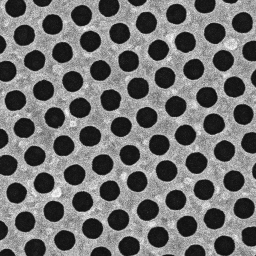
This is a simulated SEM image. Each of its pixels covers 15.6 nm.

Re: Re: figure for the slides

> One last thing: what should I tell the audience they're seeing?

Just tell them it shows a regular array of holes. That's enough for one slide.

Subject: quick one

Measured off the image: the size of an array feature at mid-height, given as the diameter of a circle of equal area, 0.333 micrometres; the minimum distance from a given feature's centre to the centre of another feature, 441 nanometres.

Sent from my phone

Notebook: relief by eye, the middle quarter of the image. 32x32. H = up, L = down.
HHHHHHHLLLLLHHLLLLLHHHHHHHHHHHLL
HHHHHHLLLLLLHHHLLLHHHHHLLLLHHHLL
LLLLHHHLLLLLHHHHHHHHHHHLLLLLHHLL
LLLLLHHLLLLHHHHHHHLLHHHLLLLLHHHL
LLLLLHHHHHHHHHHHLLLLLHHLLLLLHHHH
LLLLLHHHHHHHHHHHLLLLLHHLLLLHHHHH
HLLLHHHHHHLLLHHHLLLLLHHHHHHHHHHH
HHHHHHHHHLLLLLHHLLLLLHHHHHHHHHHH
HHHLLHHHHLLLLLHHHLLLHHHHHHLLLLHH
HHLLLLHHHLLLLLHHHHHHHHHHHHLLLLHH
HLLLLLLHHLLLLLHHHHHHHHHHHLLLLLLH
HLLLLLLHHHLLLHHHHHHLLLLHHLLLLLHH
HHLLLLHHHHHHHHHHHHLLLLLHHHLLLLHH
HHHLHHHHHHHHHLLLHHLLLLLHHHHHHHHH
HHHHHHHHHHHHLLLLLHLLLLLHHHHHHHHH
HHHHHHLHHHHHLLLLLHHLLLHHHHHHHLLL
HHHHLLLLLHHHLLLLLHHHHHHHHHHHLLLL
HHHHLLLLLHHHLLLLHHHHHHHHHHHHLLLL
LLHHLLLLLHHHHHHHHHHHHHLLLLHHLLLL
LLHHLLLLLHHHHHHHHHHHHLLLLLHHLLLL
LLLHHLLHHHHHHHHLLLHHHLLLLLHHHHHH
LLHHHHHHHHHHHHLLLLLHHLLLLLHHHHHH
LLHHHHHHHHHHHHLLLLLHHHLLLHHHHHHL
HHHHHHHLLLLLHHLLLLLHHHHHHHHHHHHL
HHHHHHHLLLLLHHHLLLHHHHHHLLLHHHLL
HLLLHHHLLLLLHHHHHHHHHHHLLLLLHHLL
LLLLLHHLLLLLHHHHHHHHHHHLLLLLHHHL
LLLLLHHHLLLHHHHHHLLLHHHLLLLLHHHH
LLLLLHHHHHHHHHHHLLLLLHHHLLLLHHHH
HLLLLHHHHHLLLHHHLLLLLHHHHHHHHHHH
HHHHHHHHHLLLLLHHLLLLLHHHHHHHHHHH
HHHHHHHHHLLLLLHHHLLLHHHHHHHHLHHH